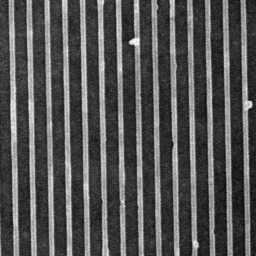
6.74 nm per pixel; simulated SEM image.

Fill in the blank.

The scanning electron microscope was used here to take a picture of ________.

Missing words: parallel lines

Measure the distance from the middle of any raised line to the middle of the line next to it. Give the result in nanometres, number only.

120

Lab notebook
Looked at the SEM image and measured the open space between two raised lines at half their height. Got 90.9 nanometres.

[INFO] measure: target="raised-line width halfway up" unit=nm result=26.9